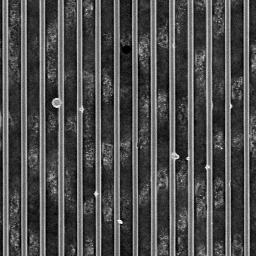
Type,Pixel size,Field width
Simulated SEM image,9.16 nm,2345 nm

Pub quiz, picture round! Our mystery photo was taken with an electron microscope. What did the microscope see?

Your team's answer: parallel lines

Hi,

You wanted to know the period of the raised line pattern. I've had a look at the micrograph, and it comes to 0.17 microns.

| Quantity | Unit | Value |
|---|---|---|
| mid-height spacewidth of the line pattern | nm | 119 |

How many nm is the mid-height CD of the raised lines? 50.4